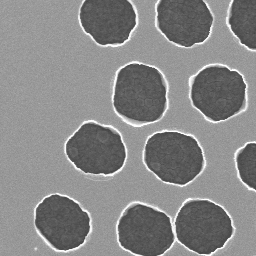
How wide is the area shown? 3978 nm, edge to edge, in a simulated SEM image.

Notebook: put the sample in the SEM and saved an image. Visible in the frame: holes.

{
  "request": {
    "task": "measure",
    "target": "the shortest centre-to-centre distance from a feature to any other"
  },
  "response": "73.4 px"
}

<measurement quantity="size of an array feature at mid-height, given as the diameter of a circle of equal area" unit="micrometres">0.856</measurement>